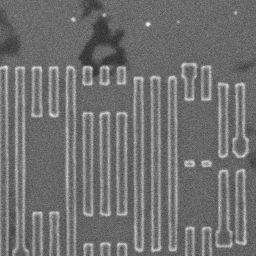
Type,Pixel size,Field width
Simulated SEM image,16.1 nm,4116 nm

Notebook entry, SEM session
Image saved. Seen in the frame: wiring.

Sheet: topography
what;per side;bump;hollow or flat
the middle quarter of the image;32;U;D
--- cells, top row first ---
DDDDDDDDDDDDDDDDDDDDDDDDDDDDDDUU
DUUDDUUDDUUDDUUDDDDDDDDDDDDDDDUU
DUUDDUUDDUUDDUUDDDDDDDDDDDDDDDUU
DUUDDUUDDUUDDUUDDDUDDDUUDDDUDDUU
DUUDDUUDDUUDDUUDDDUUDDUUDDUUDDUU
DUUDDDDDDDDDDDDDDDUUDDUUDDUUDDUU
DUUDDDDDDDDDDDDDDDUUDDUUDDUUDDUU
DUUDDDDDDDDDDDDDDDUUDDUUDDUUDDUU
DUUDDDDDDDDDDDDDDDUUDDUUDDUUDDUU
DUUDDDDDDDDDDDDDDDUUDDUUDDUUDDDD
DUUDDDDDDDDDDDDDDDUUDDUUDDUUDDDD
DUUDDDDDDDDDDDDDDDUUDDUUDDUUDDDD
DUUDDUUDDUUDDUUDDDUUDDUUDDUUDDDD
DUUDDUUDDUUDDUUUDDUUDDUUDDUUDDDD
DUUDDUUDDUUDDUUUDDUUDDUUDDUUDDDD
DUUDDUUDDUUDDUUDDDUUDDUUDDUUDDDD
DUUDDUUDDUUDDUUDDDUUDDUUDDUUDDDD
DUUDDUUDDUUDDUUDDDUUDDUUDDUUDDDD
DUUDDUUDDUUDDUUDDDUUDDUUDDUUDDDD
DUUDDUUDDUUDDUUDDDUUDDUUDDUUDDDD
DUUDDUUDDUUDDUUDDDUUDDUUDDUUDDDD
DUUDDUUDDUUDDUUUDDUUDDUUDDUUDDDD
DUUDDUUDDUUDDUUUDDUUDDUUDDUUDDDD
DUUDDUUDDUUDDUUUDDUUDDUUDDUUDDDD
DUUDDUUDDUUDDUUUDDUUDDUUDDUUDDUU
DUUDDUUDDUUDDUUUDDUUDDUUDDUUDDDD
DUUDDUUDDUUDDUUUDDUUDDUUDDUUDDDD
DUUDDUUDDUUDDUUUDDUUDDUUDDUUDDDD
DUUDDUUDDUUDDUUUDDUUDDUUDDUUDDDD
DUUDDUUDDUUDDUUUDDUUDDUUDDUUDDDD
DUUDDUUDDUUDDUUUDDUUDDUUDDUUDDDD
DUUDDUUDDUUDDUUUDDUUDDUUDDUUDDDD